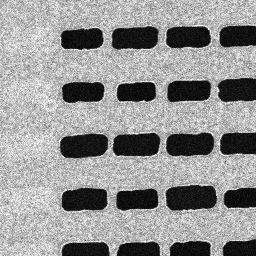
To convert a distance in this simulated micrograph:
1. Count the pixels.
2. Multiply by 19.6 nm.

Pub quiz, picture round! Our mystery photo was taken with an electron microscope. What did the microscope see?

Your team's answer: a regular array of holes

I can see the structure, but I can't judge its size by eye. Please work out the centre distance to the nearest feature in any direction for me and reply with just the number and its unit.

1040 nanometres